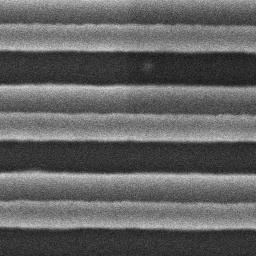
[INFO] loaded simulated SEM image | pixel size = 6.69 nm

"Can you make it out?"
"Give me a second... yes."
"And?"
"lines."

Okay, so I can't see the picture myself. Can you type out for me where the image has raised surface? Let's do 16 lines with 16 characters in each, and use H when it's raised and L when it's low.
HHHHHHHHHHHHHHHH
HHHHHHHHHHHHHHHH
HHHHHHHHHHHHHHHH
LLLLLLLLLLLLLLLL
LLLLLLLLLLLLLLLL
HHHHHHHHHHHLLLLL
HHHHHHHHHHHHHHHH
HHHHHHHHHHHHHHHH
HHHHHHHHHHHHHHHH
LLLLLLLLLLLLLLLL
LLLLLLLLLLLLLLLL
HHHHHHHHHHHHHHHH
HHHHHHHHHHHHHHHH
HHHHHHHHHHHHHHHH
LLLLLLLLLLLLLLLL
LLLLLLLLLLLLLLLL